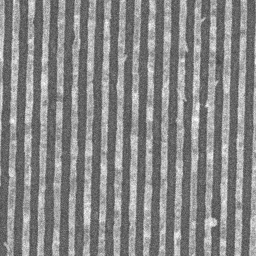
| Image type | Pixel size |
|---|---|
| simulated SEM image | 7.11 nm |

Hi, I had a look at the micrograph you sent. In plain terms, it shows parallel lines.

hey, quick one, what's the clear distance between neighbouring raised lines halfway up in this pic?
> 66.7 nanometers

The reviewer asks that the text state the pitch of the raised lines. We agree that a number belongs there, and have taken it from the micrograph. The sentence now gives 0.108 µm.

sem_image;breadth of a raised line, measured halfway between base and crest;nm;40